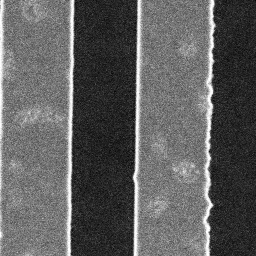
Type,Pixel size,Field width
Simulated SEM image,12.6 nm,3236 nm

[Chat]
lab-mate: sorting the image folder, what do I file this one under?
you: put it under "one or a few lines or trenches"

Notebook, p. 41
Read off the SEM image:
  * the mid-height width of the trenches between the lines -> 0.819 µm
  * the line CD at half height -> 0.929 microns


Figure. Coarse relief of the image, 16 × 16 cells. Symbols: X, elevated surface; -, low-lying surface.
XXXXX----XXXX---
XXXXX----XXXX---
XXXXX----XXXX---
XXXXX----XXXX---
XXXX-----XXXX---
XXXX-----XXXX---
XXXX-----XXXX---
XXXX-----XXXX---
XXXX-----XXXX---
XXXX-----XXXX---
XXXX----XXXXX---
XXXX----XXXXX---
XXXX-----XXXX---
XXXX-----XXXX---
XXXX----XXXXX---
XXXX----XXXXX---